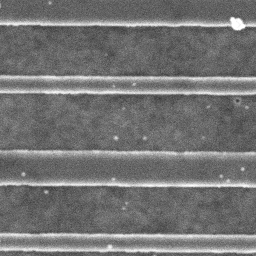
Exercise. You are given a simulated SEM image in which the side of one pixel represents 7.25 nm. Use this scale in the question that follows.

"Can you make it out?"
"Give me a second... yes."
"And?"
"lines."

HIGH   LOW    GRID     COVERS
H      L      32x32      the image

HHHHHHHHHHHHHHHHHHHHHHHHHHHHHHHH
HHHHHHHHHHHHHHHHHHHHHHHHHHHHHHHH
HHHHHHHHHHHHHHHHHHHHHHHHHHHHHHHH
LLLLLLLLLLLLLLLLLLLLLLLLLLLLLHLL
LLLLLLLLLLLLLLLLLLLLLLLLLLLLLLLL
LLLLLLLLLLLLLLLLLLLLLLLLLLLLLLLL
LLLLLLLLLLLLLLLLLLLLLLLLLLLLLLLL
LLLLLLLLLLLLLLLLLLLLLLLLLLLLLLLL
LLLLLLLLLLLLLLLLLLLLLLLLLLLLLLLL
LLLLLLLLLLLLLLLLLLLLLLLLLLLLLLLL
HHHHHHHHHHHHHHHHHHHHHHHHHHHHHHHH
HHHHHHHHHHHHHHHHHHHHHHHHHHHHHHHH
LLLLLLLLLLLLLLLLLLLLLLLLLLLLLLLL
LLLLLLLLLLLLLLLLLLLLLLLLLLLLLLLL
LLLLLLLLLLLLLLLLLLLLLLLLLLLLLLLL
LLLLLLLLLLLLLLLLLLLLLLLLLLLLLLLL
LLLLLLLLLLLLLLLLLLLLLLLLLLLLLLLL
LLLLLLLLLLLLLLLLLLLLLLLLLLLLLLLL
LLLLLLLLLLLLLLLLLLLLLLLLLLLLLLLL
HHHHHHHHHHHHHHHHHHHHHHHHHHHHHHHH
HHHHHHHHHHHHHHHHHHHHHHHHHHHHHHHH
HHHHHHHHHHHHHHHHHHHHHHHHHHHHHHHH
HHHHHHHHHHHHHHHHHHHHHHHHHHHHHHHH
LLLLLLLLLLLLLLLLLLLLLLLLLLLLLLLL
LLLLLLLLLLLLLLLLLLLLLLLLLLLLLLLL
LLLLLLLLLLLLLLLLLLLLLLLLLLLLLLLL
LLLLLLLLLLLLLLLLLLLLLLLLLLLLLLLL
LLLLLLLLLLLLLLLLLLLLLLLLLLLLLLLL
LLLLLLLLLLLLLLLLLLLLLLLLLLLLLLLL
HHHHHHHHHHHHHHHHHHHHHHHHHHHHLHHL
HHHHHHHHHHHHHHHHHHHHHHHHHHHHHHHH
LLLLLLLLLLLLLLLLLLLLLLLLLLLHLHHH